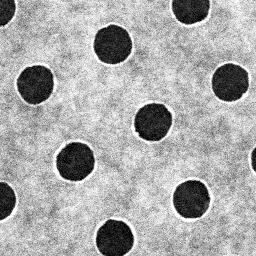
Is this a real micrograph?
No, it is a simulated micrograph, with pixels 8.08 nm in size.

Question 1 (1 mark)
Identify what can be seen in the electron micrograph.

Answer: holes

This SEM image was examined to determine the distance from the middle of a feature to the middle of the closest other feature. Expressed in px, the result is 86.7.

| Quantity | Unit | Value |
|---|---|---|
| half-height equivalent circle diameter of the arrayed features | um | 0.322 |